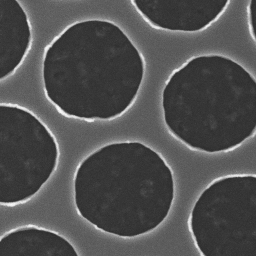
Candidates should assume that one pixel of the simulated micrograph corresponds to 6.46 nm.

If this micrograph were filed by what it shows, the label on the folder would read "holes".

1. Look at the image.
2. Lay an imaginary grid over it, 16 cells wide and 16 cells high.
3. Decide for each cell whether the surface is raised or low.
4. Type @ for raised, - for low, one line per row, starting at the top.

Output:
-@@@@@@@@-----@@
--@@@--@@@---@@@
--@@----@@@@@@@@
-@@------@@@@@@@
-@@------@@----@
@@@------@------
@@@@----@@------
--@@@@@@@@------
---@@@@@@@@-----
----@@----@@@@@@
---@@-----@@@@@@
---@@------@@---
-@@@@------@----
@@@@@-----@@----
@--@@@@--@@@----
-----@@@@@@@----